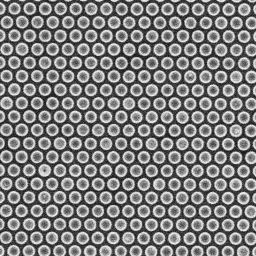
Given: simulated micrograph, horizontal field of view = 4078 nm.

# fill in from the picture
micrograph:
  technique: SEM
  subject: a regular array of raised bodies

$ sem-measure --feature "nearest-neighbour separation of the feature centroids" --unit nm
240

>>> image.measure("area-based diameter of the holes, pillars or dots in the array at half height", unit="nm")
178